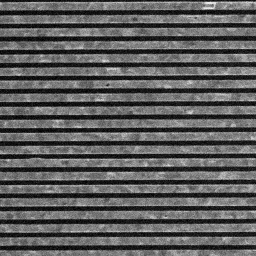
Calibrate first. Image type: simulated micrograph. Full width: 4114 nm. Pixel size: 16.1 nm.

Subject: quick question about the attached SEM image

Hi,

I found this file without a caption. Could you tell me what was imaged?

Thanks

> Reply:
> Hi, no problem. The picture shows parallel lines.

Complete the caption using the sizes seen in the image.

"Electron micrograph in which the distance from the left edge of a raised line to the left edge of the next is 0.21 micrometres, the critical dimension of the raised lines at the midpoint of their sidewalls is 7.63 px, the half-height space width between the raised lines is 0.0904 um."